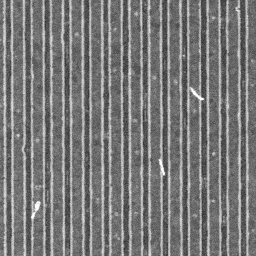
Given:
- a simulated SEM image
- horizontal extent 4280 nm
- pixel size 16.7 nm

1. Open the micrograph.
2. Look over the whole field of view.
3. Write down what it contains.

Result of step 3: parallel lines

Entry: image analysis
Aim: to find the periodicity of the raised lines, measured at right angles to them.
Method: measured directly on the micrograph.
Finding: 327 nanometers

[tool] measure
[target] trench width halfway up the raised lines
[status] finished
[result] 115 nm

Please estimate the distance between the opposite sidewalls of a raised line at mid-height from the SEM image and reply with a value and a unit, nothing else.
215 nanometers